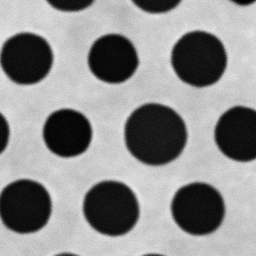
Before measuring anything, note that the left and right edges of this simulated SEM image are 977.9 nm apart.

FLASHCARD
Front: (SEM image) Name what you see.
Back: holes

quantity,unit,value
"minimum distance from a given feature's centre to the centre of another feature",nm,328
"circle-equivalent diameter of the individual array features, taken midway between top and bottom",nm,209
